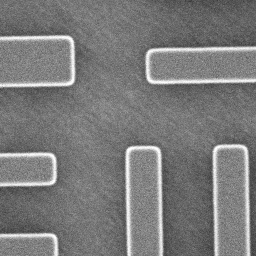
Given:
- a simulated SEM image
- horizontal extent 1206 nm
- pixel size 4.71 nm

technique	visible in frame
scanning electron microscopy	groups of lines, slits or small figures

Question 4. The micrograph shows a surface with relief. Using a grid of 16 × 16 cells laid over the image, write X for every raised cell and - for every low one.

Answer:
----------------
----------------
XXXX------------
XXXXX----XXXXXXX
XXXXX----XXXXXXX
----------------
----------------
----------------
----------------
--------XX---XX-
XXX-----XX---XX-
XXX-----XX---XX-
--------XX---XXX
--------XX---XXX
--------XX---XXX
XXXX----XX---XXX